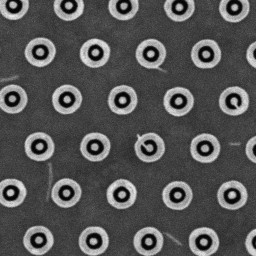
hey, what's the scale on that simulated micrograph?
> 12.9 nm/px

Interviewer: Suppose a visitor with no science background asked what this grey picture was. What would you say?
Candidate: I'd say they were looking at a regular array of ring-shaped raised bodies with a dot in the middle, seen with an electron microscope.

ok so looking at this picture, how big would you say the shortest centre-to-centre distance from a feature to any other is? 698 nm